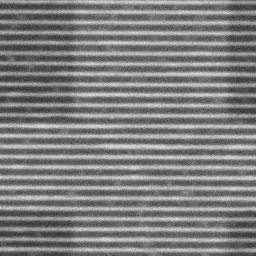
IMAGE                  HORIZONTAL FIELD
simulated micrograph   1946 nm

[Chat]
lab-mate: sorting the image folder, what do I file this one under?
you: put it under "parallel lines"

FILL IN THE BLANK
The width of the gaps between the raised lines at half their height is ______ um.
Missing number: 0.0551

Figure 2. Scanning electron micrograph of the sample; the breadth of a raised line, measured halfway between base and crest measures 21.8 nm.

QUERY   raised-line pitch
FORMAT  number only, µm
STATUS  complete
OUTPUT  0.0784